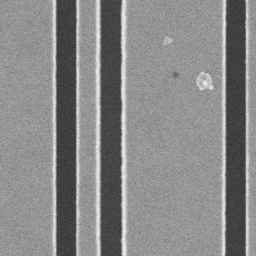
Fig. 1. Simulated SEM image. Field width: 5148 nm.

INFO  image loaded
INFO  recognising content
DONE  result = lines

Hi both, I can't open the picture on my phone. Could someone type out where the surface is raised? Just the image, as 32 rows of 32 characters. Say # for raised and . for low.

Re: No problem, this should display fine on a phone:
#######...##...#############...#
#######...##...#############...#
#######...##...#############...#
#######...##...#############...#
#######...###..#############...#
#######...##...#############...#
#######...##...#############...#
#######...##...#############...#
#######...##...#############...#
#######...##...#############...#
#######...##...#############...#
#######...##...#############...#
#######...##...#############...#
#######...##...#############...#
#######...##...#############...#
#######...##...#############...#
#######...##...#############...#
#######...##...#############...#
#######...##...#############...#
#######...##...#############...#
#######...##...#############...#
#######...##...#############...#
#######...##...#############...#
#######...##...#############...#
#######...##...#############...#
#######...##...#############...#
#######...##...#############...#
#######...##...#############...#
#######...##...#############...#
#######...##...#############...#
#######...###..#############...#
#######...###..#############...#